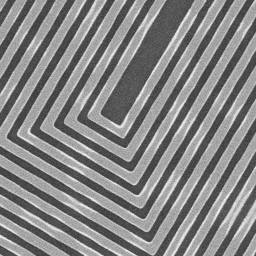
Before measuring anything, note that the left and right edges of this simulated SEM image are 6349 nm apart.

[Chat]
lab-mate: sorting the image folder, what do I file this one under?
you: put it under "groups of lines, slits or small figures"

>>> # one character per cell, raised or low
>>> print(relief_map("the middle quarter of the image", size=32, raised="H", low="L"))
HLLHHHLLHHHLLHHHLLLLLLLHHHLLHHHL
LLLHHLLLHHLLLHHLLLLLLLLHHLLLHHLL
LLHHLLLHHHLLHHLLLLLLLLHHHLLHHLLL
LLHHLLHHHLLHHHLLLLLLLHHHLLHHHLLL
LHHLLLHHLLLHHLLLLLLLLHHLLLHHLLLH
HHHLLHHHLLHHHLLLLLLLHHHLLHHHLLHH
HHLLLHHLLLHHLLLLLLLLHHLLLHHLLHHH
HHLLHHLLLHHLLLLLLLLHHLLLHHLLLHHL
HLLLHLLLHHHLLLLLLLLHHLLHHHLLHHHL
HLLHHLLLHHLLLLLLLLHHLLLHHLLLHHLL
LLHHHLLLHHLLLLLLLHHHLLHHHLLLHLLL
LLHHLLLHHLLLLLLLLHHLLLHHLLLHHLLL
LHHHLLHHHLLLLLLLHHHLLHHHLLHHLLLH
LHHLLLHHHHLLLLLLHHLLHHHLLHHHLLLH
HHHHLLLLHHHHLLLHHLLLHHLLLHHLLLHH
LHHHHLLLLLHHHLLHHLLHHHLLHHHLLHHL
LLLHHHHLLLLHHHHHLLLHHLLHHHLLLHHL
LLLLHHHHHLLLLHHHLLHHLLLHHLLLHHLL
HHLLLLHHHHLLLLLLLHHHLLLHHLLHHHLL
HHHLLLLLHHHHLLLLLHHLLLHHLLLHHLLL
LHHHHLLLLLHHHHLLHHHLLHHLLLHHHLLH
LLLHHHHLLLLHHHHHHHLLLHHLLLHHLLLH
LLLLLHHHLLLLLHHHHHLLHHHLLHHHLLHH
HHLLLLHHHHHLLLHHHLLHHHLLHHHLLHHH
HHHLLLLLHHHHLLLLLLLHHHLLHHLLLHHL
LHHHHLLLLHHHHHLLLLHHHLLHHHLLHHHL
LLLLHHHLLLLHHHHLLHHHLLLHHLLLHHLL
LLLLLHHHHLLLLHHHHHHHLLHHHLLHHHLL
HHLLLLHHHHLLLLLHHHHLLLHHLLLHHLLL
HHHHLLLLHHHHLLLLHHLLLHHLLLHHLLLH
LHHHHLLLLLHHHHLLLLLLHHHLLLHHLLHH
LLLHHHHLLLLHHHHHLLLLHHLLLHHLLLHH